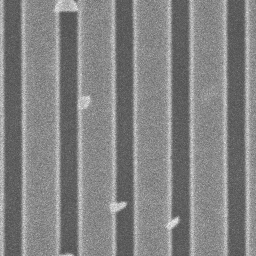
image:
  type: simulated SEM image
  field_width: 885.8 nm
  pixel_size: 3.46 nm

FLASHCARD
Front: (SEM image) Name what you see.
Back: parallel lines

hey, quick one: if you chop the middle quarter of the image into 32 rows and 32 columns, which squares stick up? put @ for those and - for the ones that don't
----@@@@@@@@@-----@@@@@@@@------
----@@@@@@@@@-----@@@@@@@@------
----@@@@@@@@@-----@@@@@@@@------
----@@@@@@@@@-----@@@@@@@@------
----@@@@@@@@@-----@@@@@@@@------
----@@@@@@@@@-----@@@@@@@@------
----@@@@@@@@@-----@@@@@@@@------
----@@@@@@@@@-----@@@@@@@@------
----@@@@@@@@@-----@@@@@@@@------
----@@@@@@@@@-----@@@@@@@@------
----@@@@@@@@@-----@@@@@@@@------
----@@@@@@@@@-----@@@@@@@@------
----@@@@@@@@@-----@@@@@@@@------
----@@@@@@@@@-----@@@@@@@@------
----@@@@@@@@@-----@@@@@@@@------
----@@@@@@@@@-----@@@@@@@@------
----@@@@@@@@@-----@@@@@@@@------
----@@@@@@@@@-----@@@@@@@@------
----@@@@@@@@@-----@@@@@@@@------
----@@@@@@@@@-----@@@@@@@@------
----@@@@@@@@@-----@@@@@@@@------
----@@@@@@@@@-----@@@@@@@@------
----@@@@@@@@@-----@@@@@@@@------
----@@@@@@@@@-----@@@@@@@@------
----@@@@@@@@@-----@@@@@@@@------
----@@@@@@@@@-----@@@@@@@@------
----@@@@@@@@@-----@@@@@@@@------
----@@@@@@@@@-----@@@@@@@@------
----@@@@@@@@@-----@@@@@@@@------
----@@@@@@@@@-----@@@@@@@@------
----@@@@@@@@@-----@@@@@@@@------
----@@@@@@@@@-----@@@@@@@@------